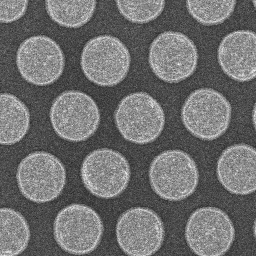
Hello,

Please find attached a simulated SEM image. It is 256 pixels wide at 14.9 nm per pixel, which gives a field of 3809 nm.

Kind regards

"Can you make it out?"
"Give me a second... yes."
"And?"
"a regular array of raised bodies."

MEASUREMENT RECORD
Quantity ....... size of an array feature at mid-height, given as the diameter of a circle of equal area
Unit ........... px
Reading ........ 48.1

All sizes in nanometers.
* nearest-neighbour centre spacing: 952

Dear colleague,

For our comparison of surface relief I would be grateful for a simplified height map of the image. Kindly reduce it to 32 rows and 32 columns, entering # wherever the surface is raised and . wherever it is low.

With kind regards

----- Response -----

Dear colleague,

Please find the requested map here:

###...######...#####....#####...
###...######...#####....#####...
##.....####.....###......###....
................................
....................###.....####
...####....####....#####....####
..######..######...######..#####
..######..######...######..#####
..######..######...#####....####
...####....#####....###......###
.....#......##..................
........................###.....
##.....#####...####....#####....
###....#####...#####...######...
####..######..######...######...
####...#####...#####...#####....
###....#####...#####....####....
##.......#......###.............
.............................##.
....##.....####.....###.....####
...#####..######...#####...#####
..######..######...######..#####
..######..######...######...####
...#####...####....#####....####
...####.....##......###.........
................................
##......####....###.....####....
###....#####...#####....#####...
####...######..#####...######...
####...######..#####...######...
###.....####...#####....#####...
##.......##.....###.....####....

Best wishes